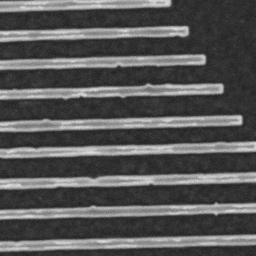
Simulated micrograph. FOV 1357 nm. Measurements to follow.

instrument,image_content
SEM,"parallel lines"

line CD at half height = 0.045 micrometres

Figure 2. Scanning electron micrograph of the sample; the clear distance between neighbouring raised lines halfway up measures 117 nm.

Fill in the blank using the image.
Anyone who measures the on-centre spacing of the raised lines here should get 0.16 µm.